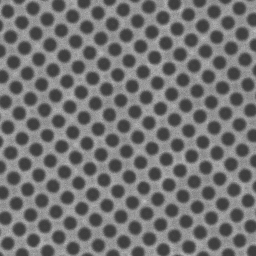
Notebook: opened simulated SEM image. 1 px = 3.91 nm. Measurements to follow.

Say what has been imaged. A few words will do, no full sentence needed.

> a regular array of holes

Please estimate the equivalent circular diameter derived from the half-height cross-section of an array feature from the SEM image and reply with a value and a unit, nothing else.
50.4 nm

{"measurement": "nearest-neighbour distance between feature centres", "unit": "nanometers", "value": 69.9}